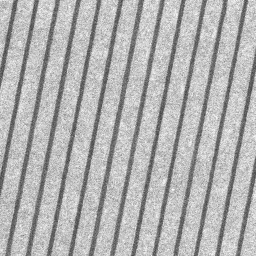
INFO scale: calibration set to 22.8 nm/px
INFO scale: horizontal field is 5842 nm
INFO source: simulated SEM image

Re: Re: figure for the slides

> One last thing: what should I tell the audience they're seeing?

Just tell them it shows parallel lines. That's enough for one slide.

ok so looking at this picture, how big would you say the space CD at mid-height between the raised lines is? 4.41 pixels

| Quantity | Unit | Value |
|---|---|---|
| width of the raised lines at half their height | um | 0.364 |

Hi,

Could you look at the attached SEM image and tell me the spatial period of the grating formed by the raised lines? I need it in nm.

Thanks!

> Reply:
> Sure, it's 469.